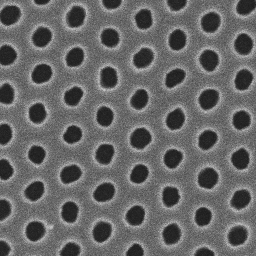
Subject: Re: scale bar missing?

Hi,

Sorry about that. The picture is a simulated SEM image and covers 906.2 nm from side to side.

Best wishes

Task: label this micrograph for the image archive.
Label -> a regular array of holes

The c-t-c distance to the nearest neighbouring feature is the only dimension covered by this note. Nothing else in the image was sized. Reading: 132 nm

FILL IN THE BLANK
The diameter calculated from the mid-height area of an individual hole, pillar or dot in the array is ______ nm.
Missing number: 67.3